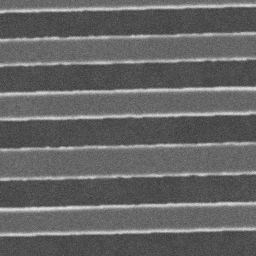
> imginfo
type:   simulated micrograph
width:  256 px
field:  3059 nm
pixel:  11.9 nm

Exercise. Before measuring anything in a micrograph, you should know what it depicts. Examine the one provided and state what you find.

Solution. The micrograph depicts lines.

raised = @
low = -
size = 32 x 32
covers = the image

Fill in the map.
@@@@@@@@@@@@@@@@@@@@@@@@@@@@@@@@
--------------------------------
--------------------------------
--------------------------------
----------------@@@@@@@@@@@@@@@@
@@@@@@@@@@@@@@@@@@@@@@@@@@@@@@@@
@@@@@@@@@@@@@@@@@@@@@@@@@@@@@@@@
@@@@@@@@@@@@@@@@@@@@@@@@@@@-----
--------------------------------
--------------------------------
--------------------------------
----------@@@@@@@@@@@@@@@@@@@@@@
@@@@@@@@@@@@@@@@@@@@@@@@@@@@@@@@
@@@@@@@@@@@@@@@@@@@@@@@@@@@@@@@@
@@@@@@@@@@@@@@@@@@@@@-----------
--------------------------------
--------------------------------
--------------------------------
-----@@@@@@@@@@@@@@@@@@@@@@@@@@@
@@@@@@@@@@@@@@@@@@@@@@@@@@@@@@@@
@@@@@@@@@@@@@@@@@@@@@@@@@@@@@@@@
@@@@@@@@@@@@@@@@@@@@@@@@@@@@@@@@
--------------------------------
--------------------------------
--------------------------------
---------------------@-@@@@@@@@@
@@@@@@@@@@@@@@@@@@@@@@@@@@@@@@@@
@@@@@@@@@@@@@@@@@@@@@@@@@@@@@@@@
@@@@@@@@@@@@@@@@@@@@@@@@@@@@@@@@
--------------------------------
--------------------------------
--------------------------------